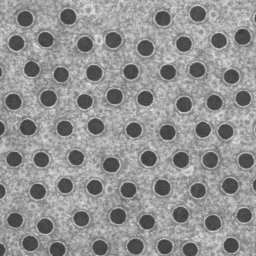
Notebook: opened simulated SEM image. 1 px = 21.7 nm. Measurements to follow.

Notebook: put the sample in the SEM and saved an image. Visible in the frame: a regular array of holes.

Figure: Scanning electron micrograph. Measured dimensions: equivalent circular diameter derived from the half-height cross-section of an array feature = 359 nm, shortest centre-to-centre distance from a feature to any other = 626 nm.